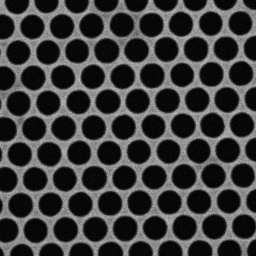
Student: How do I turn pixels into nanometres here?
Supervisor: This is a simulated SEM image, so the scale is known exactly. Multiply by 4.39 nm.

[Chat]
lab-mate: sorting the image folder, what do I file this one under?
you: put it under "a regular array of holes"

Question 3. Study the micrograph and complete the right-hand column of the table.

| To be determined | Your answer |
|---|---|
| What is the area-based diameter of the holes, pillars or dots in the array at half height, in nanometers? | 106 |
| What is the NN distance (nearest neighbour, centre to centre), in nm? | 128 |